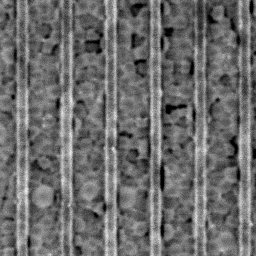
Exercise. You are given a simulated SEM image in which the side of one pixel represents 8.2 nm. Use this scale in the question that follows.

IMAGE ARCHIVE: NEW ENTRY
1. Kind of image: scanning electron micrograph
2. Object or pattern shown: parallel lines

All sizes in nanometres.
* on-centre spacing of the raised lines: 365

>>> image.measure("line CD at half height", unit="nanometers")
78.9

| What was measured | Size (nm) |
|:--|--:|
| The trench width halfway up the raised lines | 284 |